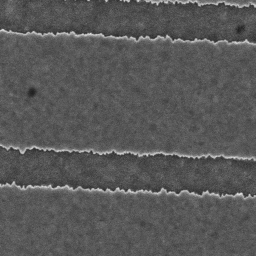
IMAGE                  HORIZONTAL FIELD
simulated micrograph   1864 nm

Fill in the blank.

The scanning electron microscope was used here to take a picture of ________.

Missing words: one or a few lines or trenches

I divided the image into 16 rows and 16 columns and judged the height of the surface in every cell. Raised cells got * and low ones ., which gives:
................
................
*************...
****************
****************
****************
****************
****************
****************
*....***********
................
*...............
****************
****************
****************
****************